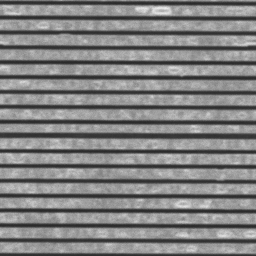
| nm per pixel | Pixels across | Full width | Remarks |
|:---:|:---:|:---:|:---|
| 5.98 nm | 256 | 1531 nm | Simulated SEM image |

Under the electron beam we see parallel lines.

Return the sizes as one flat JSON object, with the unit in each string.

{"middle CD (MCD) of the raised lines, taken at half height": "67.3 nm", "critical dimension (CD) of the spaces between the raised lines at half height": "20.9 nm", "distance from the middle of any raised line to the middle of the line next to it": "88.8 nanometers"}